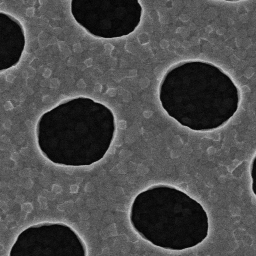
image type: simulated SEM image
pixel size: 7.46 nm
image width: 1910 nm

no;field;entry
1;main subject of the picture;holes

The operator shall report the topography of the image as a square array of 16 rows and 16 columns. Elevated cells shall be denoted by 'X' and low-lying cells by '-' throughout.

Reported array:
XXXX-----XXXXXXX
-XXXX----XXXXXXX
--XXXXXXXXXXXXXX
-XXXXXXXXXXXXXXX
XXXXXXXXXXX---XX
XXXXXXXXXX-----X
XXXX--XXXX-----X
XX-----XXXX---XX
XX-----XXXXXXXXX
XXX----XXXXXXXXX
XXXXXXXXXXXXXXXX
XXXXXXXXXXXXXXXX
XXXXXXXX----XXXX
XXXXXXXX-----XXX
X----XXXX----XXX
X----XXXXX--XXXX